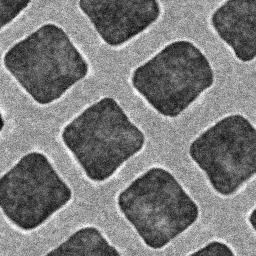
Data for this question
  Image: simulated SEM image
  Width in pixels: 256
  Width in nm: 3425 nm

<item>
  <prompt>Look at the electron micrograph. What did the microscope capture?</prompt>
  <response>holes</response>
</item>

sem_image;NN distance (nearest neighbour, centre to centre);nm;1220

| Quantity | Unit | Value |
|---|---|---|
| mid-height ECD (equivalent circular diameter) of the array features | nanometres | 980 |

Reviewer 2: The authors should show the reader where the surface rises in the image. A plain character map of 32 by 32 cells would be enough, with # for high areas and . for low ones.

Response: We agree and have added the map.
....######..........########....
...#######..........#######.....
..#########.........######......
#####...####......#########.....
###.....#####....##########.....
##.......####..######...####....
#.........##########.....####...
#..........########.......####.#
#..........######.........######
##.........######..........#####
###......########..........#####
###.....#########........#######
####...######.####......########
###########....####....#########
##########......#####.#######.##
#########........##########....#
########..........#######.......
########..........######........
#########.........######........
###...###........#######........
##....####.....##########.......
#......####...####...####.......
........###..####.....####.....#
.........#######.......####...##
.........######.........########
........#######.........########
.......########..........#######
#.....##########.........######.
##..######..#####.......########
#########....#####....##########
########......####...#####..####
######.........#########.....###